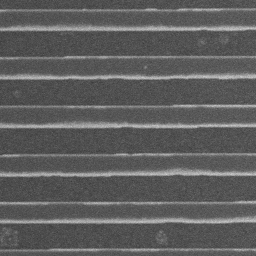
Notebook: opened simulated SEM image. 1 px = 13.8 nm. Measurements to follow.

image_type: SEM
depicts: lines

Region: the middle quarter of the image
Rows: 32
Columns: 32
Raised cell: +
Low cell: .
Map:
++++++++++++++++++++++++++++++++
++++++++++++++++++++++++++++++++
++++++++++++++++++++++++++++++++
................................
................................
................................
................................
................................
................................
................................
...........................+++++
++++++++++++++++++++++++++++++++
++++++++++++++++++++++++++++++++
++++++++++++++++++++++++++++++++
++++++++++++++++++++++++++++++++
++++..++++++++++++++++++++++++++
................................
................................
................................
................................
................................
................................
................................
++++++++++++++++++++++++++++++++
++++++++++++++++++++++++++++++++
++++++++++++++++++++++++++++++++
++++++++++++++++++++++++++++++++
+++++++++++++++++++++++++++.....
................................
................................
................................
................................